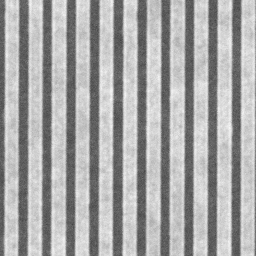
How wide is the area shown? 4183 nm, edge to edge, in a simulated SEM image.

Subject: parallel lines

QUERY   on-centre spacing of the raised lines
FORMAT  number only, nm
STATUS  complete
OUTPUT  386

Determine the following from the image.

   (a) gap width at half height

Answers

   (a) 206 nanometres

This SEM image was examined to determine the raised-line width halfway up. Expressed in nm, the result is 192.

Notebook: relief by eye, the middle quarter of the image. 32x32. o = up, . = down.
...ooo...ooo...ooo...ooo...ooo..
...ooo...ooo...ooo...ooo...ooo..
...ooo...ooo...ooo...ooo...ooo..
...ooo...ooo...ooo...ooo...ooo..
...ooo...ooo...ooo...ooo...ooo..
...ooo...ooo...ooo...ooo...ooo..
...ooo...ooo...ooo...ooo...ooo..
...ooo...ooo...ooo...ooo...ooo..
...ooo...ooo...ooo...ooo...ooo..
...ooo...ooo...ooo...ooo...ooo..
...ooo...ooo...ooo...ooo...ooo..
...ooo...ooo...ooo...ooo...ooo..
...ooo...ooo...ooo...ooo...ooo..
...ooo...ooo...ooo...ooo...ooo..
...ooo...ooo...ooo...ooo...ooo..
...ooo...ooo...ooo...ooo...ooo..
...ooo...ooo...ooo...ooo...ooo..
...ooo...ooo...ooo...ooo...ooo..
...ooo...ooo...ooo...ooo...ooo..
...ooo...ooo...ooo...ooo...ooo..
...ooo...ooo...ooo...ooo...ooo..
...ooo...ooo...ooo...ooo...ooo..
...ooo...ooo...ooo...ooo...ooo..
...ooo...ooo...ooo...ooo...ooo..
...ooo...ooo...ooo...ooo...ooo..
...ooo...ooo...ooo...ooo...ooo..
...ooo...ooo...ooo...ooo...ooo..
...ooo...ooo...ooo...ooo...ooo..
...ooo...ooo...ooo...ooo...ooo..
...ooo...ooo...ooo...ooo...ooo..
...ooo...ooo...ooo...ooo...ooo..
...ooo...ooo...ooo...ooo...ooo..